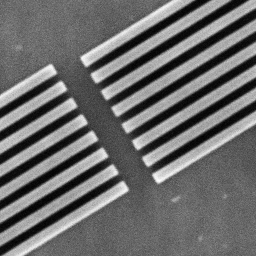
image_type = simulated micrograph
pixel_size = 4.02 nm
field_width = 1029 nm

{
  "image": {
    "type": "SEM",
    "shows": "groups of lines, slits or small figures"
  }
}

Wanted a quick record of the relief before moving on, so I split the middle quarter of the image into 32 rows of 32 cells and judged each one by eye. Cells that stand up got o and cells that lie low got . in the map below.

..........ooooo.....oooo.....ooo
.........ooooo....ooooo....ooooo
.......ooooo....ooooo.....ooooo.
.......ooo.....oooo.....ooooo...
........o....ooooo....ooooo.....
...........ooooo.....ooooo....oo
..........ooooo....ooooo....oooo
..........ooo....ooooo.....ooooo
..........o.....ooooo....ooooo..
ooo...........ooooo.....oooo....
ooo..........oooo.....ooooo....o
oo..........oooo....ooooo.....oo
.............o.....ooooo....oooo
...oo............ooooo.....oooo.
..oooo..........oooo.....ooooo..
ooooo..........oooo....ooooo....
ooo............oo....ooooo.....o
oo....o.............ooooo....ooo
....oooo..........ooooo.....oooo
...ooooo.........ooooo....ooooo.
.ooooo............oo....ooooo...
oooo.....o.............ooooo....
ooo....oooo..........ooooo.....o
o....ooooo..........oooo.....ooo
....ooooo...........ooo....ooooo
..ooooo...................oooo..
.ooooo....ooo...........ooooo...
oooo....ooooo.........ooooo.....
oo.....ooooo...........ooo......
o....ooooo......................
....ooooo....oo.................
..ooooo....ooooo................